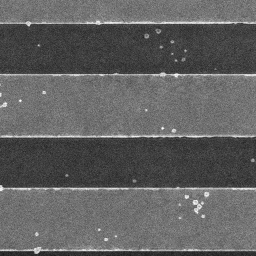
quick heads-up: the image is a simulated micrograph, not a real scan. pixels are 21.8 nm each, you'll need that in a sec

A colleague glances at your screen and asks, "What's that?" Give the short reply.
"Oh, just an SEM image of lines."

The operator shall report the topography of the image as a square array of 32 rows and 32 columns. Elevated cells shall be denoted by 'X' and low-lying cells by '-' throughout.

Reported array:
XXXXXXXXXXXXXXXXXXXXXXXXXXXXXXXX
XXXXXXXXXXXXXXXXXXXXXXXXXXXXXXXX
XXXXXXXXXXXXXXXXXXXXXXXXXXXXXXXX
--------------------------------
--------------------------------
--------------------------------
--------------------------------
--------------------------------
--------------------------------
XXXXXXXXXXXXXXXXXXXXXXXXXXXXXXXX
XXXXXXXXXXXXXXXXXXXXXXXXXXXXXXXX
XXXXXXXXXXXXXXXXXXXXXXXXXXXXXXXX
XXXXXXXXXXXXXXXXXXXXXXXXXXXXXXXX
XXXXXXXXXXXXXXXXXXXXXXXXXXXXXXXX
XXXXXXXXXXXXXXXXXXXXXXXXXXXXXXXX
XXXXXXXXXXXXXXXXXXXXXXXXXXXXXXXX
XXXXXXXXXXXXXXXXXXXXXXXXXXXXXXXX
--------------------------------
--------------------------------
--------------------------------
--------------------------------
--------------------------------
--------------------------------
X-------------------------------
XXXXXXXXXXXXXXXXXXXXXXXXXXXXXXXX
XXXXXXXXXXXXXXXXXXXXXXXXXXXXXXXX
XXXXXXXXXXXXXXXXXXXXXXXXXXXXXXXX
XXXXXXXXXXXXXXXXXXXXXXXXXXXXXXXX
XXXXXXXXXXXXXXXXXXXXXXXXXXXXXXXX
XXXXXXXXXXXXXXXXXXXXXXXXXXXXXXXX
XXXXXXXXXXXXXXXXXXXXXXXXXXXXXXXX
----X---------------------------